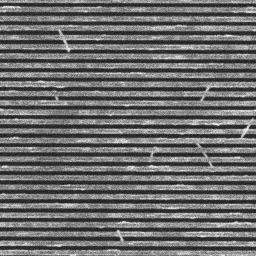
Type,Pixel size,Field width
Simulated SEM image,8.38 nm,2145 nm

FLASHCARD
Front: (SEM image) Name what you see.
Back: parallel lines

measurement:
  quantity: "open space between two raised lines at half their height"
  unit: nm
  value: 36.7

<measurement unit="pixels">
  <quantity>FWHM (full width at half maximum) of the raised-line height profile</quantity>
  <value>5.25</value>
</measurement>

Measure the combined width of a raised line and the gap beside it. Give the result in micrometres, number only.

0.0784